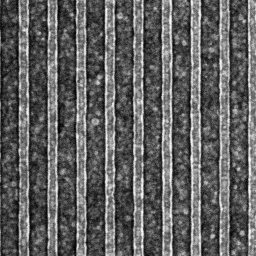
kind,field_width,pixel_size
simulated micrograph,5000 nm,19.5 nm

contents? parallel lines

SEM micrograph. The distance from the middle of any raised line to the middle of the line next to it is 560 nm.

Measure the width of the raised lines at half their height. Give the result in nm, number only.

159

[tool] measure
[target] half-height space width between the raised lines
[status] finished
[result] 405 nm